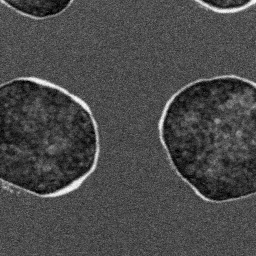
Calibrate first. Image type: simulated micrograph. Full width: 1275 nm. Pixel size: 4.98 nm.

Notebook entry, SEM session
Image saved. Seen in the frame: holes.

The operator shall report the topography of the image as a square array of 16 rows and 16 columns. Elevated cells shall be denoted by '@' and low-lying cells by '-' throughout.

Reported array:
@---@@@@@@@@@--@
@@@@@@@@@@@@@@@@
@@@@@@@@@@@@@@@@
@@@@@@@@@@@@@@@@
@@@@@@@@@@@@@@@@
----@@@@@@@@----
-----@@@@@@-----
------@@@@------
------@@@@------
------@@@@@-----
------@@@@@-----
@----@@@@@@@----
@@@@@@@@@@@@@-@@
@@@@@@@@@@@@@@@@
@@@@@@@@@@@@@@@@
@@@@@@@@@@@@@@@@